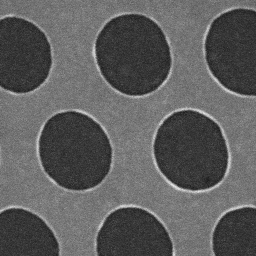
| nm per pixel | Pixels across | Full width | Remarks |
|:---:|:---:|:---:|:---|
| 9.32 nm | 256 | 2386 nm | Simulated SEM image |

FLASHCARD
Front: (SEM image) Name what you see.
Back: holes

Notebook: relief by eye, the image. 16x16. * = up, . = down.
****************
..*****...***...
...***....***...
...***.....**...
...***.....**...
..*****...****..
****************
***...****...***
**.....***....**
**.....***....**
***....***....**
****..*****...**
****************
..*****...****..
...***....***...
....**.....**...